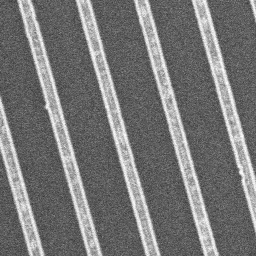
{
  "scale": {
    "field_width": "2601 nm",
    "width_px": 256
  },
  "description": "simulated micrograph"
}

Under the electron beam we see parallel lines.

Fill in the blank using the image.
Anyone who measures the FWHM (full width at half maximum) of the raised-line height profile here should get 110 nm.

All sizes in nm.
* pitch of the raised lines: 569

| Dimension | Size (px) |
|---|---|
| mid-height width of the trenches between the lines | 44.9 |